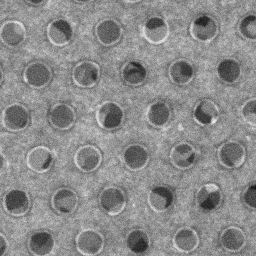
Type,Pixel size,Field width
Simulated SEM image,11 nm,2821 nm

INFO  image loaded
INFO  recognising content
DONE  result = a regular array of raised bodies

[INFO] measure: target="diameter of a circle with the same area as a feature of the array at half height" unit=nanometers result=287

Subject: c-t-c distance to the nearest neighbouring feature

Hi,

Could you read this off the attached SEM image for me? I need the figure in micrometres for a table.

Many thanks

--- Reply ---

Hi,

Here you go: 0.525